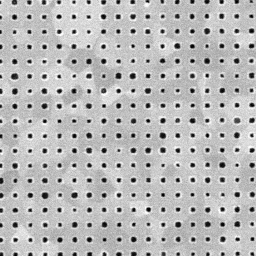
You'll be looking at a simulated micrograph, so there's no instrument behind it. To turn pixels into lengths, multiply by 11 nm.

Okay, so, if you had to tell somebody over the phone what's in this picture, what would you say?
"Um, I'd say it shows a regular array of holes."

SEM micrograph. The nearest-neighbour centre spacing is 159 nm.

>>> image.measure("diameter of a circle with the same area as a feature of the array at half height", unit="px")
6.08